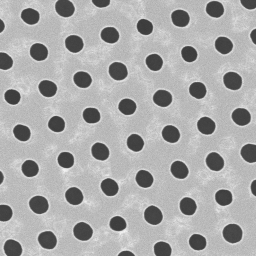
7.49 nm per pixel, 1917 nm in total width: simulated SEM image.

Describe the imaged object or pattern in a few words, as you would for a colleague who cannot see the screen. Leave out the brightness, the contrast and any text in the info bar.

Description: a regular array of holes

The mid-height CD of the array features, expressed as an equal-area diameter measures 0.131 microns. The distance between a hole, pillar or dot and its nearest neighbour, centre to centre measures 270 nanometres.